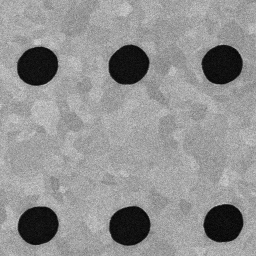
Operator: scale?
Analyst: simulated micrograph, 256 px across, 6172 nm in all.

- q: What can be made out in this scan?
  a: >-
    holes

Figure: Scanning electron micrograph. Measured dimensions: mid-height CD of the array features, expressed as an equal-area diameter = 0.966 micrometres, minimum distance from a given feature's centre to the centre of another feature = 2210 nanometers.